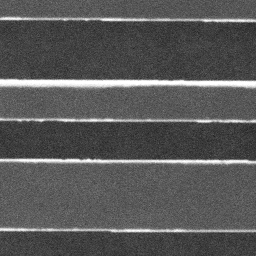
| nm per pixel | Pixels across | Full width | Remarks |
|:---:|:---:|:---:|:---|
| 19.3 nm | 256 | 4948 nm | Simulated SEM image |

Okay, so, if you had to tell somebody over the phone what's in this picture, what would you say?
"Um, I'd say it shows lines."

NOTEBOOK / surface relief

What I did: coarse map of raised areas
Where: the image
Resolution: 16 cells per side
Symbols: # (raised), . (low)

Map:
################
................
................
................
................
################
################
..##############
................
................
################
################
################
################
................
................